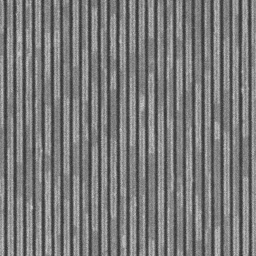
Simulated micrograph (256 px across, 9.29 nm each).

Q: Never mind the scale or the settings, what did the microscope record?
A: parallel lines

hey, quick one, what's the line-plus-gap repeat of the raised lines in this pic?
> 0.0874 micrometres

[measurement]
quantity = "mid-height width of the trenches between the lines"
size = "41.8 nm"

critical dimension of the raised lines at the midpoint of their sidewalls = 0.0499 µm